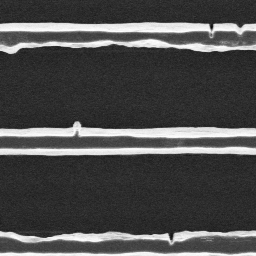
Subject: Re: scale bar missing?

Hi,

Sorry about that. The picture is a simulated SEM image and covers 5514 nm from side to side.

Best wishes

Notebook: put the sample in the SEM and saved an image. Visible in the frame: one or a few lines or trenches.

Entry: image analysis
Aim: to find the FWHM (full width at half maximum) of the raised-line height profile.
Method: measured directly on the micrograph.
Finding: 0.401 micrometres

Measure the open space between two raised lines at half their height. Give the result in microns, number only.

1.84